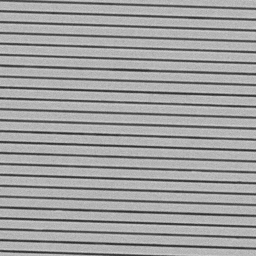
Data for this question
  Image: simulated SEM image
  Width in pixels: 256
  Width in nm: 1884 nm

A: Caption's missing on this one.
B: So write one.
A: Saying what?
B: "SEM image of parallel lines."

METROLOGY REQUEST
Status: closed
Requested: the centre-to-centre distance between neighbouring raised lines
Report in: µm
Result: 0.0802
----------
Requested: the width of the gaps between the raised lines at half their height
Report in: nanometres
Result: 19.3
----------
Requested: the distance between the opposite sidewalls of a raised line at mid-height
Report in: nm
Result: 62.5